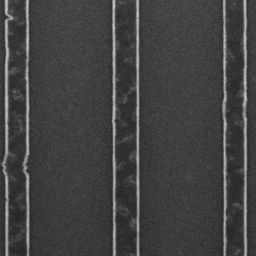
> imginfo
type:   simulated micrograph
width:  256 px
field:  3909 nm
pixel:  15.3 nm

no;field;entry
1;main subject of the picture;one or a few lines or trenches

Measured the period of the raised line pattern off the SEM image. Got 1670 nanometres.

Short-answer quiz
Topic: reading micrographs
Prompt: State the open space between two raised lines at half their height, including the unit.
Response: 1320 nm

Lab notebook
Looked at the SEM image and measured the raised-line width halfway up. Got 336 nanometres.